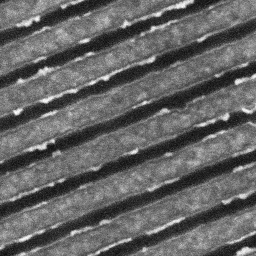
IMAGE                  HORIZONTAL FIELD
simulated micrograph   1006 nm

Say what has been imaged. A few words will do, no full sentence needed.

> parallel lines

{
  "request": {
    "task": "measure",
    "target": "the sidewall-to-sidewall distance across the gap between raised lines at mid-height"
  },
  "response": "90.5 nm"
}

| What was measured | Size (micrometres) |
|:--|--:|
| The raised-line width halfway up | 0.0653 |